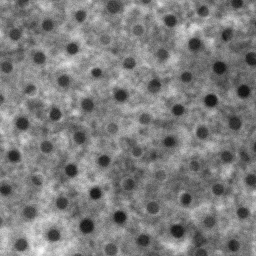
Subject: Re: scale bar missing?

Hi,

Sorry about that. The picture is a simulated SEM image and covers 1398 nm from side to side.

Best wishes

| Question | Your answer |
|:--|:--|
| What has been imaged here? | a regular array of raised bodies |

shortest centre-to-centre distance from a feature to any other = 183 nm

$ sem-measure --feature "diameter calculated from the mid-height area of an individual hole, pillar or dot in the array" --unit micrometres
0.0765